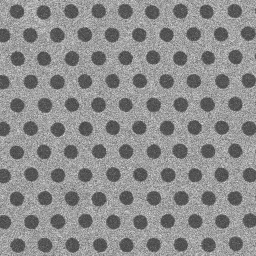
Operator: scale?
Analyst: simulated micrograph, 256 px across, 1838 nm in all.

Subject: a regular array of holes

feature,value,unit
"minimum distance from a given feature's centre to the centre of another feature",0.19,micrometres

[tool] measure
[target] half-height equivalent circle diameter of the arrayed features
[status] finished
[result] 0.104 µm